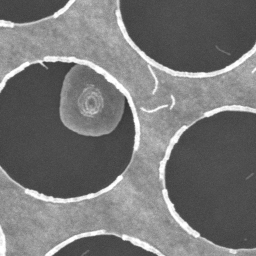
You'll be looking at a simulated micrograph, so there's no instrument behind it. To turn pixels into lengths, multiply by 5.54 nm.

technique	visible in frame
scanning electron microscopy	holes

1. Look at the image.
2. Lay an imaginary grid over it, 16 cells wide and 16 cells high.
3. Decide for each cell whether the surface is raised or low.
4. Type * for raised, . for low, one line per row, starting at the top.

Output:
....***.........
********........
********........
*********......*
*.....*****..***
.......*********
........********
........****....
........***.....
........***.....
........**......
*......***......
***********.....
***********.....
************....
****.....*****..